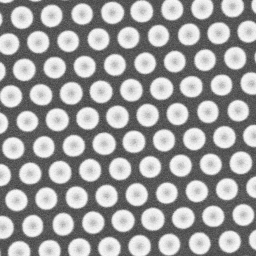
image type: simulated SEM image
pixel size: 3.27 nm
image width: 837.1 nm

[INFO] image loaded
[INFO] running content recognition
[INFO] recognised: an array of small figures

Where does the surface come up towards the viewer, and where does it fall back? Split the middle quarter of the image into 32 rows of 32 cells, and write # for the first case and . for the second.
...#####..#####...#####..#####..
...#####..#####...####....###...
...####.....##..................
..............................##
........##.....####...#####..###
####...#####..#####...#####..###
####...#####..#####...#####..###
#####..#####..#####...#####...##
####...#####...####....###......
###.....##......................
...................###.....###..
....####...####....####...#####.
#..#####...#####..######..#####.
#..######..#####..#####...#####.
#..#####...#####...####....###..
#...####....###.....##..........
...............................#
.........##.....###....####...##
.###....####...#####..#####...##
#####..######..#####..######..##
#####..######..#####...####...##
#####...####....###.....##......
.###.....##.....................
....................###....####.
.....###....####...#####...#####
#...#####...####...#####...#####
##..#####..######..#####...#####
##..#####...####....###.....###.
#....###....###.................
................................
..........##.....###....####...#
.####...#####...#####..#####...#